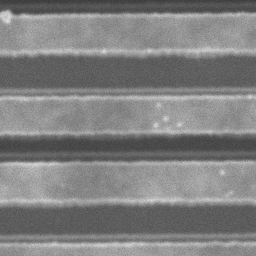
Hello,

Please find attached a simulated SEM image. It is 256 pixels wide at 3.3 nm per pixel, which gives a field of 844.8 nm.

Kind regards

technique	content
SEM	lines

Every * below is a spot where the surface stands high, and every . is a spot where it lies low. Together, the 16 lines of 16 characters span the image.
................
****************
****************
................
................
................
****************
****************
................
................
****************
****************
****************
................
................
****************